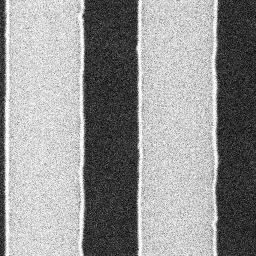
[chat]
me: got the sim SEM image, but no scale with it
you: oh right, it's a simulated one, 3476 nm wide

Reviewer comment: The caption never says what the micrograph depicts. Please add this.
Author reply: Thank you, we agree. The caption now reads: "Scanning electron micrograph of one or a few lines or trenches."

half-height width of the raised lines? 799 nanometers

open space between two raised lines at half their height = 1000 nm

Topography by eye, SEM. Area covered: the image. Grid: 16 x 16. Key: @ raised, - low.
-----@@@@----@@@
-----@@@@----@@@
-----@@@@----@@@
-----@@@@----@@@
-----@@@@----@@@
-----@@@@----@@@
-----@@@@----@@@
-----@@@@----@@@
-----@@@@----@@@
-----@@@@----@@@
-----@@@@----@@@
-----@@@@----@@@
-----@@@@----@@@
-----@@@@----@@@
-----@@@@----@@@
-----@@@@----@@@